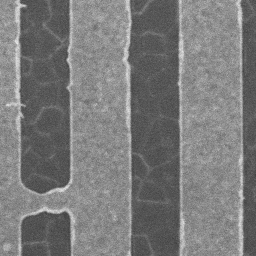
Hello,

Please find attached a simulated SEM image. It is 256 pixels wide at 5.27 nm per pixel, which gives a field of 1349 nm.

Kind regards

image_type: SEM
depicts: one or a few lines or trenches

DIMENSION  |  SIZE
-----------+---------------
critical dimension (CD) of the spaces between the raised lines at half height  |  0.267 microns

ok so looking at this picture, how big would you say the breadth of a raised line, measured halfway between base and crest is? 319 nm